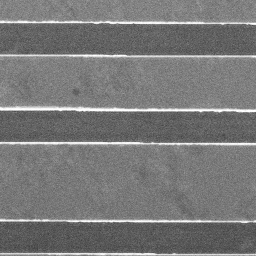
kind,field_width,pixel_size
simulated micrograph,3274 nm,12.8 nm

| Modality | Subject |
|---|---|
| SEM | lines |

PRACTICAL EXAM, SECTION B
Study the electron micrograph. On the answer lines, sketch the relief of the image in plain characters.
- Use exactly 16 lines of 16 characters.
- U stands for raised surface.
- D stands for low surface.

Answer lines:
UUUUUUUUUUUUUUUU
DDDDDDDDDDDDDDDD
DDDDDDDDDDDDDDDD
UUUUUUUUDDDDDDDD
UUUUUUUUUUUUUUUU
UUUUUUUUUUUUUUUU
UUUUUUUUUUUUUUUU
DDDDDDDDDDDDDDDD
DDDDDDDDDDDDDDDD
UUUUUUUUUUUUUUUU
UUUUUUUUUUUUUUUU
UUUUUUUUUUUUUUUU
UUUUUUUUUUUUUUUU
UUUUUUUUUUUUUUUU
DDDDDDDDDDDDDDDD
DDDDDDDDDDDDDDDD